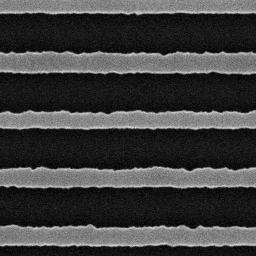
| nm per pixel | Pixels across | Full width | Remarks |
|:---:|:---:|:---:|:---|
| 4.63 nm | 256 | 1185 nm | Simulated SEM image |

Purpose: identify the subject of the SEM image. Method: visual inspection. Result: lines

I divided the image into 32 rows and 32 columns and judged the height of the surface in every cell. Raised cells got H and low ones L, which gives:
HHHHHHHHHHHHHHHHHHHHHHHHHHHHHHHH
HHHHHHHHHHHHHHHHHHHHHHHHHHHHHHHH
LLLLLLLLLLLLLLLLLLLLLLLLLLLLLLLL
LLLLLLLLLLLLLLLLLLLLLLLLLLLLLLLL
LLLLLLLLLLLLLLLLLLLLLLLLLLLLLLLL
LLLLLLLLLLLLLLLLLLLLLLLLLLLLLLLL
LLLLLHHLHLLLHLLLLLLLLLLLLLLLLLLL
HHHHHHHHHHHHHHHHHHHHHHHHHHHHHHHH
HHHHHHHHHHHHHHHHHHHHHHHHHHHHHHHH
LLLLLLLLLLLLLLLLLLLLLLLLLLLLLLLL
LLLLLLLLLLLLLLLLLLLLLLLLLLLLLLLL
LLLLLLLLLLLLLLLLLLLLLLLLLLLLLLLL
LLLLLLLLLLLLLLLLLLLLLLLLLLLLLLLL
LLLLLLLLLLLLLLLLLLLLLLLLLLLLLLLL
HHHHHHHHHHHHHHHHHHHHHHHHHHHHHHHH
HHHHHHHHHHHHHHHHHHHHHHHHHHHHHHHH
LLLLLLLLLLLLLLLLLLLLLLLLLLLLLLLL
LLLLLLLLLLLLLLLLLLLLLLLLLLLLLLLL
LLLLLLLLLLLLLLLLLLLLLLLLLLLLLLLL
LLLLLLLLLLLLLLLLLLLLLLLLLLLLLLLL
LLLLLLLLLLLLLLLLLLLLLLLLLLLLLLLL
HHHHHHHHHHHHHHHHHHHHHHHHHHHHHHHH
HHHHHHHHHHHHHHHHHHHHHHHHHHHHHHHH
LLLLLHLLHLLLLLLLLLLLLLHLLLLLLLLL
LLLLLLLLLLLLLLLLLLLLLLLLLLLLLLLL
LLLLLLLLLLLLLLLLLLLLLLLLLLLLLLLL
LLLLLLLLLLLLLLLLLLLLLLLLLLLLLLLL
LLLLLLLLLLLLLLLLLLLLLLLLLLLLLLLL
HHHHHHHHHHHHLHHHHHHHHHHHHHHHHHHH
HHHHHHHHHHHHHHHHHHHHHHHHHHHHHHHH
HHHHHHHHHHHHHHHHHHHHHHHHHHHHHHHH
LLLLLLLLLLLLLLLLLLLLLLLLLLLLLLLL